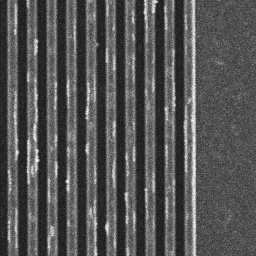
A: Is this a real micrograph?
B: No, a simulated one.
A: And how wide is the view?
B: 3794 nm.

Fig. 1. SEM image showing parallel lines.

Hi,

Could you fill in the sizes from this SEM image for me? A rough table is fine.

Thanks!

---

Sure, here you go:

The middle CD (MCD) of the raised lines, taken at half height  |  0.139 um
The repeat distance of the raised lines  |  0.291 microns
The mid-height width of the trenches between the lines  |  150 nm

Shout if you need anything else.